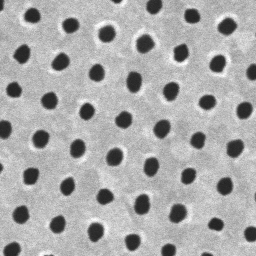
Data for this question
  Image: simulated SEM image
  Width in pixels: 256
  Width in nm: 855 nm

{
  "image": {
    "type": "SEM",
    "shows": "a regular array of holes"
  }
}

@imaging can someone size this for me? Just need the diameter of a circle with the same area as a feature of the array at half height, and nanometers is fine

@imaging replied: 56.2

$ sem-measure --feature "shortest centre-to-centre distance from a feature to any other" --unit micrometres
0.126